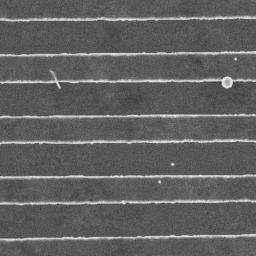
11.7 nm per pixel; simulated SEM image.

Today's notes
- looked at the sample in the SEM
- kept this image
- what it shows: lines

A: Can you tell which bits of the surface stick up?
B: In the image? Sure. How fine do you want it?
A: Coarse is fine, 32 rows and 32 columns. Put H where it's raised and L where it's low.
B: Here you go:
HHHHHHHHHHHHHHHHHHHHHHHHHHHHHHHH
HHHHHHHHHHHHHHHHHHHHHHHHHHHHHHHH
HHHHLLLLLLLLLLLLLLLLLLLLLLLLLLLL
LLLLLLLLLLLLLLLLLLLLLLLLLLLLLLLL
LLLLLLLLLLLLLLLLLLLLLLLLLLLLLLLL
LLLLLLLLLLLLLLLLLLLLLLLLLLLLLLLL
LLLLLLLLLLLLLLLLLLLLLLLLLLLLLLLL
HHHHHHHHHHHHHHHHHHHHHHHHHHHHHHHH
HHHHHHHHHHHHHHHHHHHHHHHHHHHHHHHH
HHHHHHHHHHHHHHHHHHHHHHHHHHHHHHHH
LLLLLLLLLLLLLLLLLLLLLLLLLLLLHLLL
LLLLLLLLLLLLLLLLLLLLLLLLLLLLLLLL
LLLLLLLLLLLLLLLLLLLLLLLLLLLLLLLL
LLLLLLLLLLLLLLLLLLLLLLLLLLLLLLLL
LLLLLLLLLLLLLLLLHLHHHHHHHHHHHHHH
HHHHHHHHHHHHHHHHHHHHHHHHHHHHHHHH
HHHHHHHHHHHHHHHHHHHHHHHHHHHHHHHH
HHHHHHHHHHHHHHHHHHHHHHHHHHHHHHHH
LLLLLLLLLLLLLLLLLLLLLLLLLLLLLLLL
LLLLLLLLLLLLLLLLLLLLLLLLLLLLLLLL
LLLLLLLLLLLLLLLLLLLLLLLLLLLLLLLL
LLLLLLLLLLLLLLLLLLLLLLLLLLLLLLLL
HHHHHHHHHHHHHHHHHHHHHHHHHHHHHHHH
HHHHHHHHHHHHHHHHHHHHHHHHHHHHHHHH
HHHHHHHHHHHHHHHHHHHHHHHHHHHHHHHH
LLHLLLLLLLLLLLLLLLLLLLLLLLLLLLLL
LLLLLLLLLLLLLLLLLLLLLLLLLLLLLLLL
LLLLLLLLLLLLLLLLLLLLLLLLLLLLLLLL
LLLLLLLLLLLLLLLLLLLLLLLLLLLLLLLL
LLLLLLLLLLLLLLLLLLLLLHHHHHHHHHHH
HHHHHHHHHHHHHHHHHHHHHHHHHHHHHHHH
HHHHHHHHHHHHHHHHHHHHHHHHHHHHHHHH